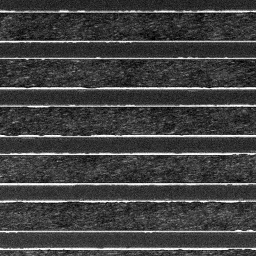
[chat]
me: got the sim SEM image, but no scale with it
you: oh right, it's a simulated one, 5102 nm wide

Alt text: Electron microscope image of lines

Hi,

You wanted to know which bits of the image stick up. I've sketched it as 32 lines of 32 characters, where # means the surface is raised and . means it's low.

################################
................................
................................
................................
................................
################################
################################
................................
................................
................................
................................
################################
################################
................................
................................
................................
................................
################################
################################
................................
................................
................................
................................
################################
################################
................................
................................
................................
................................
################################
################################
................................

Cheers